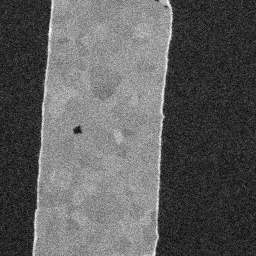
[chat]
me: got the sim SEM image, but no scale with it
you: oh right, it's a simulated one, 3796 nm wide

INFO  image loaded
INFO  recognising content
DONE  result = one or a few lines or trenches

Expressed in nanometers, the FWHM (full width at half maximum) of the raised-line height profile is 1770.